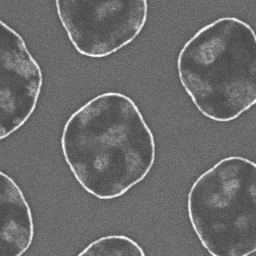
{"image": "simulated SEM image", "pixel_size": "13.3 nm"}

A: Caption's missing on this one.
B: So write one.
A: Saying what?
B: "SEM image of raised bodies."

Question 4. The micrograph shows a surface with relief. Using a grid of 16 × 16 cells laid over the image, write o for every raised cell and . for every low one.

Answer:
....ooooo.......
....ooooo....oo.
o...oooo....oooo
oo.........ooooo
oo.........ooooo
oo..........oooo
oo...ooo....oooo
oo..ooooo.......
....ooooo.......
....oooooo......
....ooooo....ooo
o....ooo....oooo
oo..........oooo
oo..........oooo
oo..........oooo
oo...oooo....ooo